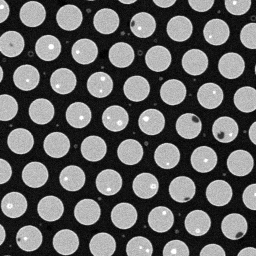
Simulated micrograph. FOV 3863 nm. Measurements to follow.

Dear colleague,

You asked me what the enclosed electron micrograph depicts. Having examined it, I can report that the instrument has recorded an array of small figures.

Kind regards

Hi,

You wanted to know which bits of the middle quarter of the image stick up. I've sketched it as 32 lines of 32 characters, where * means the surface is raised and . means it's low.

.............***.....*****....**
*.....................***.....**
**.....****.....................
***...******....****............
***...******...******....****...
***...******...******...******..
**....******...******...******..
*......****....******...******..
................****....******..
.........................****...
.*****......**..................
.*****....*****......**.........
.******...******....****......**
.******...******...******....***
.*****....******...******...****
..***.....*****....******...****
...........***.....******...****
.....................**......***
*.....***.....................**
*....*****.....****.............
*...******....*****.....****....
*...******...*******...******...
....******...*******...******...
.....*****....*****....******...
...............****....*****....
.*......................****....
****......**....................
*****....*****.....***..........
*****...******....*****.....***.
*****...******...******....*****
*****...******...*******..******
.***.....*****...******...******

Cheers